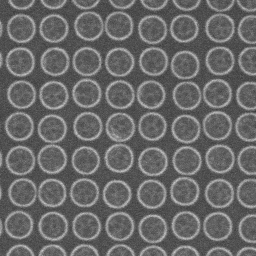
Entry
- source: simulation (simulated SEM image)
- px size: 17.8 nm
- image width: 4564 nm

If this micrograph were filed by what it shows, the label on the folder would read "a regular array of raised bodies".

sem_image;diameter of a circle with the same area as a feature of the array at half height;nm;479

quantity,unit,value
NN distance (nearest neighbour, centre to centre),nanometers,565